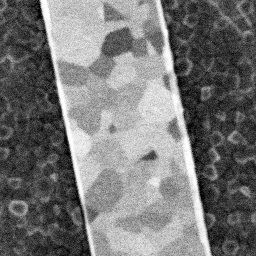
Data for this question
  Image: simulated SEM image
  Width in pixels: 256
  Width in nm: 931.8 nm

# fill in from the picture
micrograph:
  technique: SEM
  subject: one or a few lines or trenches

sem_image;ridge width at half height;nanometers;412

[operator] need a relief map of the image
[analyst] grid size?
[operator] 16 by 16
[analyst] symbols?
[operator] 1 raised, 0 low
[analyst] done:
0001111111000000
0001111111000000
0001111111000000
0001111111100000
0000111111100000
0000111111100000
0000111111100000
0000111111100000
0000111111110000
0000011111110000
0000011111110000
0000011111110000
0000011111110000
0000011111111000
0000001111111000
0000001111111000